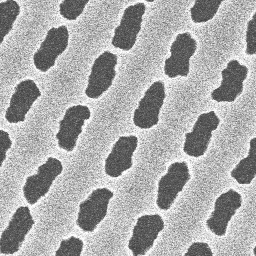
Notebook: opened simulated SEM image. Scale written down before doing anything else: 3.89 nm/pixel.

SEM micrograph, a regular array of holes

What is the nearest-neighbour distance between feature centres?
222 nanometers